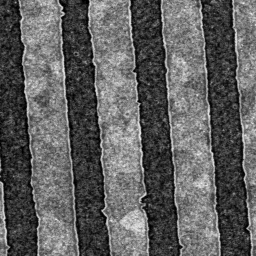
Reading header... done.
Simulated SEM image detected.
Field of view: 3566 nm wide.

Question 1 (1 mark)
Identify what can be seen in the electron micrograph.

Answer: one or a few lines or trenches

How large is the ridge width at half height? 547 nanometers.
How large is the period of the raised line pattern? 70.6 px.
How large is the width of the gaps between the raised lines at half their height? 439 nanometres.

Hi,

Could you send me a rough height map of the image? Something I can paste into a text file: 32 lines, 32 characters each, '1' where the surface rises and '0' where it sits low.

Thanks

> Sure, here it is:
00011110000111110000111110000111
00011111000111110000111110000111
00011111000111110000111110000111
00011111000111110000111110000111
00011111000111110000111110000111
00011111000011111000011111000011
00011111000011111000011111000011
00011111000011111000011111000011
00011111000011111000011111000011
00011111000011111000011111000011
00011111000011111000011111000011
00011111000011111000011111000011
00011111000011111000011111000011
00011111000011111000011111000011
00001111000011111000011111000011
00001111100011111000011111000011
00001111100001111100011111000011
00001111100001111100011111000011
00001111100001111100001111000001
00001111100001111100001111100011
00001111100001111100001111100011
00001111100001111100001111100001
00001111100001111100001111100001
00001111100001111100001111100001
00001111100001111100001111100001
00001111100001111100001111100001
00000111100001111100001111100001
10000111100001111100001111100001
10000111100000111100001111100001
10000111110000111100001111100001
10000111110000111110000111100001
10000111110000111100000111100001